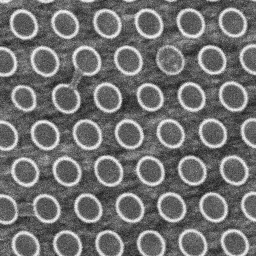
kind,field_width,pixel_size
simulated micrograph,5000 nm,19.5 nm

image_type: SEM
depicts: a regular array of raised bodies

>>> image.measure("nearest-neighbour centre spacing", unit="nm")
812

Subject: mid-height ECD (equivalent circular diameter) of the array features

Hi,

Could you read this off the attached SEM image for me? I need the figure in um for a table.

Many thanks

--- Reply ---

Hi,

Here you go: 0.515